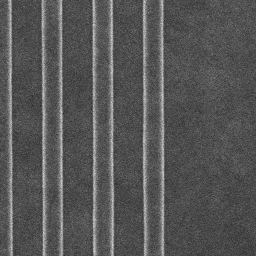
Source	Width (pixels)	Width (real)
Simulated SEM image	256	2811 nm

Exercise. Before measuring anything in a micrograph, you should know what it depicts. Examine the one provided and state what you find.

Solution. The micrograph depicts parallel lines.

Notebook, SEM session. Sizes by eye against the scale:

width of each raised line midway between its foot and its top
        19.5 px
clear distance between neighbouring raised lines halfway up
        31.1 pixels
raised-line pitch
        554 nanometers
